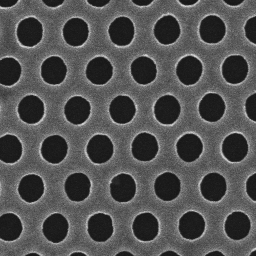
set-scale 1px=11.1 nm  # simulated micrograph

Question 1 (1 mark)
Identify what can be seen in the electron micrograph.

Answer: a regular array of holes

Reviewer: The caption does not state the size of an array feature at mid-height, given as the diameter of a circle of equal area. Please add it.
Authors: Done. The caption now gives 307 nm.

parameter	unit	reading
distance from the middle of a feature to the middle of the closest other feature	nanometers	491